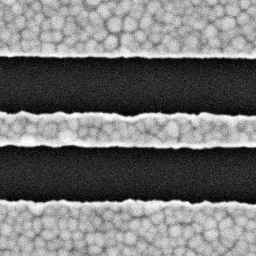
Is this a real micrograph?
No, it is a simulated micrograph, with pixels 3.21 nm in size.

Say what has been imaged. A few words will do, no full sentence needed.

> lines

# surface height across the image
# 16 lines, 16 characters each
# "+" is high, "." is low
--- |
++++++++++++++++
++++++++++++++++
++++++++++++++++
+.++++++++++++++
................
................
................
++++++++++++++++
++++++++++++++++
................
................
................
................
++++++++++++++++
++++++++++++++++
++++++++++++++++